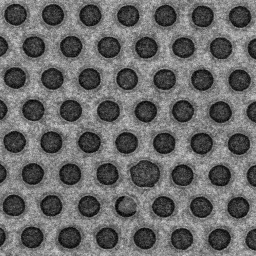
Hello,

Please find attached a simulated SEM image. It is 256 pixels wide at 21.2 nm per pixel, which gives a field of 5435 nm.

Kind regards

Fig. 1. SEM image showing a regular array of holes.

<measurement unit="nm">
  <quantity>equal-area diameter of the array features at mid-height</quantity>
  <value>480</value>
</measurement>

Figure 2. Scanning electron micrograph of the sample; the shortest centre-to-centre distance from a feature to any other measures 36.6 px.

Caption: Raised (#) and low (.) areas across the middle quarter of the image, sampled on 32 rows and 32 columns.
################################
#####...######...#######...#####
####.....####.....#####.....####
####.....####......###......####
####.....####......###......####
####.....####.....#####.....####
#####..########..########.######
################################
################################
...######....######...######...#
....####......####.....####.....
.....###......####.....####.....
....####......####.....####.....
....#####....#####.....####.....
#.#########.########.########..#
################################
################################
####....######...######....#####
####.....####.....####......####
###......####......###......####
####.....####.....####......####
####....#####.....#####....#####
########################..######
################################
###################...##########
...######....####.......####...#
....####......##........###.....
.....###......##........###.....
....####......###.......###.....
....#####....####......####.....
##################.....######..#
################################